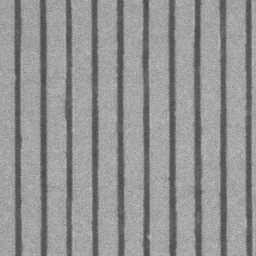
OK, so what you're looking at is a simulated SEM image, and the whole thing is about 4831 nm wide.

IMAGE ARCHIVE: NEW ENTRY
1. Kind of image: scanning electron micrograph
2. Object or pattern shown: parallel lines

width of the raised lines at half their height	352	nanometers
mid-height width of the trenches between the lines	130	nm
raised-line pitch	484	nm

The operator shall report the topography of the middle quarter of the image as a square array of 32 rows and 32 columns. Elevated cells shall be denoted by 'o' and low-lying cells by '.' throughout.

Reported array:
..ooooo..oooo..ooooo.ooooo..oooo
..ooooo..oooo..ooooo.ooooo..oooo
..ooooo..oooo..ooooo.ooooo..oooo
..ooooo..oooo..ooooo.ooooo..oooo
..ooooo..oooo..ooooo.ooooo..oooo
..ooooo..oooo..ooooo.ooooo..oooo
..ooooo..oooo..ooooo.ooooo..oooo
..ooooo..oooo..ooooo.ooooo..oooo
..ooooo..oooo..ooooo.ooooo..oooo
..ooooo..oooo..ooooo..oooo..oooo
..ooooo..oooo..ooooo..oooo..oooo
..ooooo..oooo..ooooo..oooo..oooo
..ooooo..oooo..ooooo..oooo..oooo
..ooooo..oooo..ooooo..oooo..oooo
..ooooo..oooo..ooooo..oooo..oooo
..ooooo..oooo..ooooo..oooo..oooo
..ooooo..oooo..ooooo..oooo..oooo
..ooooo..oooo..ooooo..oooo..oooo
..ooooo..oooo..ooooo..oooo..oooo
..ooooo..oooo..ooooo..oooo..oooo
..ooooo..oooo..ooooo..oooo..oooo
..ooooo..oooo..ooooo..oooo..oooo
..ooooo..oooo..ooooo..oooo..oooo
..ooooo..oooo..ooooo..oooo..oooo
..ooooo..oooo..ooooo..oooo..oooo
..ooooo..oooo..ooooo..oooo..oooo
..ooooo..oooo..ooooo..oooo..oooo
..ooooo..oooo..ooooo..oooo..oooo
..ooooo..oooo..ooooo..oooo..oooo
..ooooo..oooo..ooooo..oooo..oooo
..ooooo..oooo..ooooo..oooo..oooo
..ooooo..oooo..ooooo..oooo..oooo